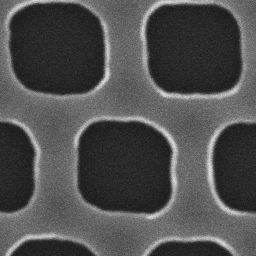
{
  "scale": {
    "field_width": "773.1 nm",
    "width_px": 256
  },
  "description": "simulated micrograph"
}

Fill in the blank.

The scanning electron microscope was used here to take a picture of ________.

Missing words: holes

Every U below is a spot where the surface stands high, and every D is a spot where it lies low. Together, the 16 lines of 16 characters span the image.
UDDDDUUUUUDDDDUU
UDDDDDUUUDDDDDDU
UDDDDDDUUDDDDDDU
UDDDDDDUUDDDDDDU
UDDDDDDUUDDDDDDU
UUDDDDUUUUDDDDDU
UUUUUUUUUUUUUUUU
UUUUUUUUUUUUUUUU
DDUUUDDDDDUUUUDD
DDUUUDDDDDDUUDDD
DDUUUDDDDDDUUDDD
DDUUUDDDDDDUUDDD
DDUUUDDDDDDUUUDD
UUUUUUUUUUUUUUUU
UUUUUUUUUUUUUUUU
UDDDDDUUUUDDDDUU